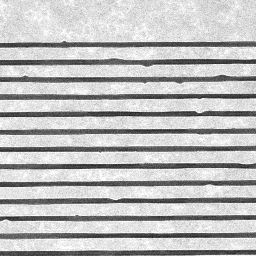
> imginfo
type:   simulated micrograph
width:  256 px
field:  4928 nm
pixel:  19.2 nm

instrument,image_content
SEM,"parallel lines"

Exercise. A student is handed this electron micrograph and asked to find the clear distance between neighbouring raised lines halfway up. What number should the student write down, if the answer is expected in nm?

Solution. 96.3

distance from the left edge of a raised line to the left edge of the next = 334 nm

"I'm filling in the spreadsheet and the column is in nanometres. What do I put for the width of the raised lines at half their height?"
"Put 229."